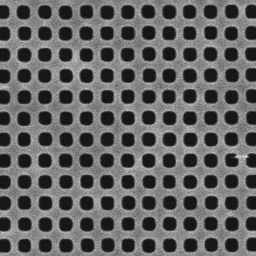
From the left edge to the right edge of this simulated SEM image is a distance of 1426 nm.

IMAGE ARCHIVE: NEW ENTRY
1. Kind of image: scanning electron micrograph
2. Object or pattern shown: a regular array of holes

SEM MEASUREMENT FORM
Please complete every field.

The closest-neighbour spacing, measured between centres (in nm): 114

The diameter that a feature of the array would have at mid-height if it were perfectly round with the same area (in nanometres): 81.2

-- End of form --